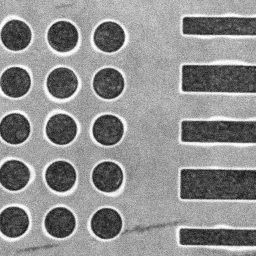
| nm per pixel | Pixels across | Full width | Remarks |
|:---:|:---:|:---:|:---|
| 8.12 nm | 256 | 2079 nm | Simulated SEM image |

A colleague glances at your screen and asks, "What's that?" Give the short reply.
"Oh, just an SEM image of groups of lines, slits or small figures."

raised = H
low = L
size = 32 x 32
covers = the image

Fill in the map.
HHHHHHHHHHHHHHHHHHHHHHHHHHHHHHHH
HHHHHHHHHHHHHHHHHHHHHHHHHHHHHHHH
HLLHHHHHHHHHHHHHHHHHHHHLLLLLLLLL
LLLLHHLLLLHHLLLHHHHHHHHLLLLLLLLL
LLLLHHLLLLHHLLLLHHHHHHHHHLLLLLLL
LLLLHHLLLLHHLLLLHHHHHHHHHHHHHHHH
HHHHHHHLLHHHHLHHHHHHHHHHHHHHHHHH
HHHHHHHHHHHHHHHHHHHHHHHHHHHHHHHH
HLLHHHHLHHHHHLHHHHHHHHHLLLLLLLLL
LLLLHHLLLLHHLLLHHHHHHHHLLLLLLLLL
LLLLHHLLLLHHLLLLHHHHHHHLLLLLLLLL
LLLHHHLLLHHHLLLHHHHHHHHLLLLLLLLL
HHHHHHHLHHHHHHHHHHHHHHHHHHHHHHHH
HHHHHHHHHHHHHHHHHHHHHHHHHHHHHHHH
HLLHHHLLLHHHLLLHHHHHHHHHHHHHHHHH
LLLLHHLLLLHHLLLLHHHHHHHLLLLLLLLL
LLLLHHLLLLHLLLLHHHHHHHHLLLLLLLLL
LLLHHHLLLHHHLLLHHHHHHHHLLLLLLLLL
HHHHHHHHHHHHHHHHHHHHHHHHHHHHHHHH
HHHHHHHHHHHHHHHHHHHHHHHHHHHHHHHH
LLLHHHLLLHHHLLLHHHHHHHHHHHHHHHHH
LLLLHHLLLHHHLLLHHHHHHHHLLLLLLLLL
LLLLHHLLLHHHLLLHHHHHHHLLLLLLLLLL
HLLHHHLLLHHHLLLHHHHHHHLLLLLLLLLL
HHHHHHHHHHHHHHHHHHHHHHHLLLLLLLLL
HHHHHHHHHHHHHHHHHHHHHHHHHHHHHHHH
LLLHHHLLLHHHLLLHHHHHHHHHHHHHHHHH
LLLLHHLLLHHLLLLHHHHHHHHHHHHHHHHH
LLLLHHLLLHHLLLLHHHHHHHHLLLHLLHHH
LLLHHHLLLHHHLLLHHHHHHHLLLLLLLLLL
HHHHHHHHHHHHHHHHHHHHHHHLLLLLLLLL
HHHHHHHHHHHHHHHHHHHHHHHHHHHHHHHH